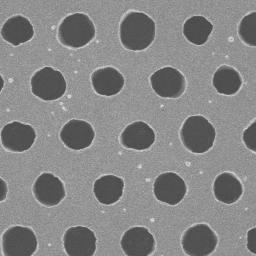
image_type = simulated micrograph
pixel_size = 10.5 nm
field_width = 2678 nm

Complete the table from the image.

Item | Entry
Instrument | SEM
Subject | a regular array of holes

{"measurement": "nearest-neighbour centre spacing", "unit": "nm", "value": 618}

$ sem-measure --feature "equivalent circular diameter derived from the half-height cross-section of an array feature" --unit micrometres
0.321